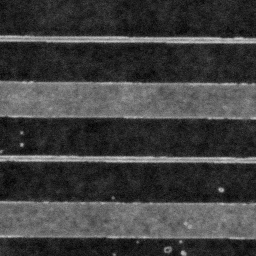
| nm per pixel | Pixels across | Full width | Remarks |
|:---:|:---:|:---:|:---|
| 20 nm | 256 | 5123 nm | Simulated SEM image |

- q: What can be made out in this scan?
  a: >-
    lines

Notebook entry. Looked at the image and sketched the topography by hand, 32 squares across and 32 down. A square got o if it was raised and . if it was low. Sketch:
................................
................................
................................
................................
................................
................................
................................
................................
................................
................................
oooooooooooooooooooooooooooooo..
oooooooooooooooooooooooooooooooo
oooooooooooooooooooooooooooooooo
oooooooooooooooooooooooooooooooo
.ooooooooooooooooooooooooooooooo
................................
................................
................................
................................
................................
................................
................................
................................
................................
................................
ooooooooooooooooooooooooooooooo.
oooooooooooooooooooooooooooooooo
oooooooooooooooooooooooooooooooo
oooooooooooooooooooooooooooooooo
oooooooooooooooooooooooooooooooo
................................
................................